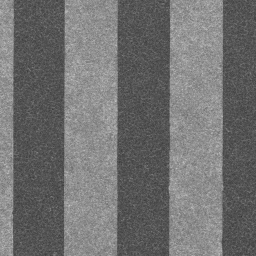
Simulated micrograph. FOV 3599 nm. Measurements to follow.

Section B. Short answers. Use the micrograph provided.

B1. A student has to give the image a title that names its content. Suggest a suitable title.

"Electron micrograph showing one or a few lines or trenches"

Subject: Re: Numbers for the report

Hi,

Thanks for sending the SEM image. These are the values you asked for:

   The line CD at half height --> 736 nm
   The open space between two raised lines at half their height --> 52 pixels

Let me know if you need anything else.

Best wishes